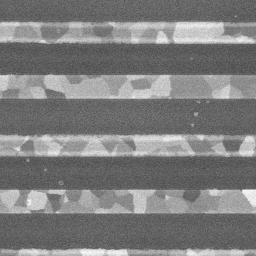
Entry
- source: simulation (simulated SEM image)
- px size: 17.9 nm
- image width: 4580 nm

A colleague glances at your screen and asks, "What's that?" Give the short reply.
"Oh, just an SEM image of lines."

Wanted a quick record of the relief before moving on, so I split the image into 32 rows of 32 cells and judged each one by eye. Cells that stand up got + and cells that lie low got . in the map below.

................................
................................
................................
++++++++++++++++++++++++++++++++
++++++++++++++++++++++++++++++++
................................
................................
................................
................................
++++++++++++++++++++++++++++++++
++++++++++++++++++++++++++++++++
++++++++++++++++++++++++++++++++
................................
................................
................................
................................
................................
++++++++++++++++++++++++++++++++
++++++++++++++++++++++++++++++++
................................
................................
................................
................................
................................
++++++++++++++++++++++++++++++++
++++++++++++++++++++++++++++++++
++++++++++++++++++++++++++++++++
................................
................................
................................
................................
++++++++++++++++++++++++++++++++